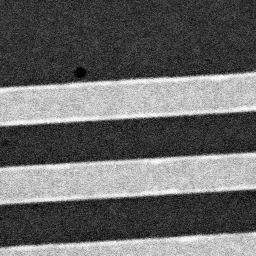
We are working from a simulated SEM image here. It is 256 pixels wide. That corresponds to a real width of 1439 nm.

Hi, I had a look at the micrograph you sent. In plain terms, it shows one or a few lines or trenches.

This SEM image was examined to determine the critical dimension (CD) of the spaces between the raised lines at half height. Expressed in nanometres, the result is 253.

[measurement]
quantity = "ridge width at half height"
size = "195 nm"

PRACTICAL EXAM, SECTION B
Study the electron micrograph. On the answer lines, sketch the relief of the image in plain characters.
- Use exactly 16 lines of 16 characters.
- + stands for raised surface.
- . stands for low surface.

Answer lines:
................
................
................
................
................
.+++++++++++++++
++++++++++++++++
+++++...........
................
................
.+++++++++++++++
++++++++++++++++
++++............
................
................
.+++++++++++++++